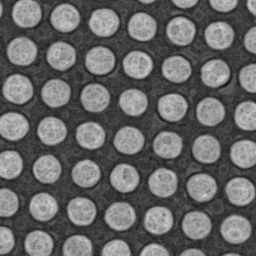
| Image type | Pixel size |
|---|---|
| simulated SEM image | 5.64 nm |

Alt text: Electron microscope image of a regular array of raised bodies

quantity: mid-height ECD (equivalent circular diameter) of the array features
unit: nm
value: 156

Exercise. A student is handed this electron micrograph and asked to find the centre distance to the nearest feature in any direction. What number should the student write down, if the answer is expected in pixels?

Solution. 37.9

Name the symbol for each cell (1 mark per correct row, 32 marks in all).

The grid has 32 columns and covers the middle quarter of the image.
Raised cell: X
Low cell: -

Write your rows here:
XX----XXXXXX---XXXXXXX---XXXXXX-
------XXXXXX---XXXXXXX---XXXXXXX
---------X------XXXXX----XXXXXXX
--------------------------XXXXX-
--------------------------------
X-----XXX-----------------------
XX---XXXXXX------X--------------
X----XXXXXX----XXXXX------------
X---XXXXXXX---XXXXXX-----XXXXX--
X---XXXXXXX---XXXXXXX---XXXXXX--
-----XXXXXX---XXXXXXX---XXXXXXX-
------XXX------XXXXX----XXXXXXX-
----------------XXX-----XXXXXX--
-------------------------XXXX---
--------------------------------
----XXXXX-----------------------
---XXXXXXX----XXXX--------------
---XXXXXXX---XXXXXX-----XXXX----
---XXXXXXX---XXXXXXX---XXXXXX---
----XXXXXX---XXXXXXX---XXXXXX---
-----XXXX----XXXXXX----XXXXXX---
--------------XXXXX----XXXXXX---
-----------------------XXXXXX---
-------------------------XX-----
----XXX-------------------------
---XXXXX------XX----------------
--XXXXXXX----XXXXX-----XXX------
--XXXXXXX---XXXXXX----XXXXXX----
--XXXXXXX---XXXXXXX--XXXXXXX----
---XXXXX----XXXXXXX--XXXXXXX---X
----XXX-----XXXXXX---XXXXXXX---X
--------------XXX-----XXXXXX---X